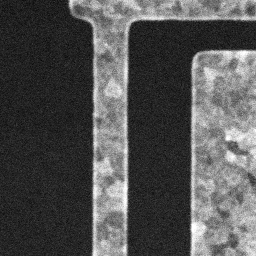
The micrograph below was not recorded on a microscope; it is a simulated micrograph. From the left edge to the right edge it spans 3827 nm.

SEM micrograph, wiring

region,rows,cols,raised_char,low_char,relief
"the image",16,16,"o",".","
.....ooooooooooo
......oo........
......oo........
......oo.....ooo
......oo....oooo
......oo....oooo
......oo....oooo
......oo....oooo
......oo....oooo
......oo....oooo
......oo....oooo
......oo....oooo
......oo....oooo
......oo....oooo
......oo....oooo
......oo....oooo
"